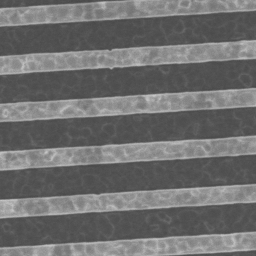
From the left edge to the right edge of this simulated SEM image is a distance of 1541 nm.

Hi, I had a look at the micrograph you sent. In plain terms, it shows parallel lines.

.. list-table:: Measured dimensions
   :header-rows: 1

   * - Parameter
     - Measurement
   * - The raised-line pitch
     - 288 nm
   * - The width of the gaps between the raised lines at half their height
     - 182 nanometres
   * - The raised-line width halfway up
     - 109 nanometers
